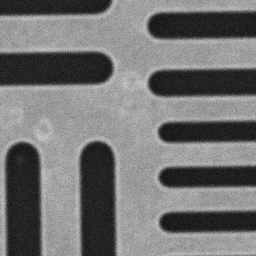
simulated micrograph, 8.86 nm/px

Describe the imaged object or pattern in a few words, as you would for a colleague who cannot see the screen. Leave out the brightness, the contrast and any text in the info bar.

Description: groups of lines, slits or small figures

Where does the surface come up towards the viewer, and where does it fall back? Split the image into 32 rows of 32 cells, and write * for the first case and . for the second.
..............******************
.............******.............
******************..............
******************..............
*******************.............
********************************
.............*******************
..............******************
..............******............
..............*****.............
.............*****..............
*******************.............
********************************
********************************
********************************
********************............
*******************.............
***********..*******............
*....*****....******************
.....*****.....*****************
.....*****.....************.....
.....*****.....*****............
.....*****.....*****............
.....*****.....*****............
.....*****.....*****************
.....*****.....*****************
.....*****.....******...........
.....*****.....*****............
.....*****.....*****............
.....*****.....*****************
.....*****.....*****************
*....*****.....*****************